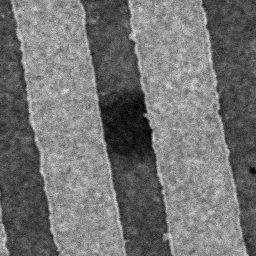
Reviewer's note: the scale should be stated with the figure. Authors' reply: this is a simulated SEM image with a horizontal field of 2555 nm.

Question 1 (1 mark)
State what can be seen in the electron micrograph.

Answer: one or a few lines or trenches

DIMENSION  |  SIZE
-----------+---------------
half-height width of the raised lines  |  682 nanometres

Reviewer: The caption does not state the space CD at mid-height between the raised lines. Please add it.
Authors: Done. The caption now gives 482 nanometres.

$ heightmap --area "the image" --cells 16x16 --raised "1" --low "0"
0111100011111000
0111100011111000
0111100011111000
0111110001111000
0011110001111000
0011110001111000
0011110001111100
0011110001111100
0011110000111100
0001111000111100
0001111000111100
0001111000111110
0001111000111110
0001111000111110
0001111100011110
0000111100011110